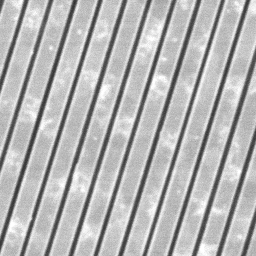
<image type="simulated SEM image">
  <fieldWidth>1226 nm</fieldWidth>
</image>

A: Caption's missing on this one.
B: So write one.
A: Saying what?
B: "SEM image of parallel lines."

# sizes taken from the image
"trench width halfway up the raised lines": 25.8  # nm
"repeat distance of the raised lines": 0.113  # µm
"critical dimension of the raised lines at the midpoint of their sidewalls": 86.5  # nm